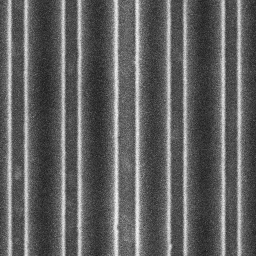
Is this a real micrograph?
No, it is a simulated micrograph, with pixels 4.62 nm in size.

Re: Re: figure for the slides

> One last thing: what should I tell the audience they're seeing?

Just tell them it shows parallel lines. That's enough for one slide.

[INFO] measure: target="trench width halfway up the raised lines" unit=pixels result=14.6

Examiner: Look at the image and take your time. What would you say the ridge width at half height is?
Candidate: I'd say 0.179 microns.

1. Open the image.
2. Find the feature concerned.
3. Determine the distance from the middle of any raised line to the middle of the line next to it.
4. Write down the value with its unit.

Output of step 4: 245 nm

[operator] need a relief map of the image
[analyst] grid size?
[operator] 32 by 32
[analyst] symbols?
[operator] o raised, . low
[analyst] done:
o..ooooo..ooooo..oooo..ooooo..oo
o..ooooo..ooooo..oooo..ooooo..oo
o..ooooo..ooooo..oooo..ooooo..oo
o..ooooo..ooooo..oooo..ooooo..oo
o..ooooo..ooooo..oooo..ooooo..oo
o..ooooo..ooooo..oooo..ooooo..oo
o..ooooo..ooooo..oooo..ooooo..oo
o..ooooo..ooooo..oooo..ooooo..oo
o..ooooo..ooooo..oooo..ooooo..oo
o..ooooo..ooooo..oooo..ooooo..oo
o..ooooo..ooooo..oooo..ooooo..oo
o..ooooo..ooooo..oooo..ooooo..oo
o..ooooo..ooooo..oooo..ooooo..oo
o..ooooo..ooooo..oooo..ooooo..oo
o..ooooo..ooooo..oooo..ooooo..oo
o..ooooo..ooooo..oooo..ooooo..oo
o..ooooo..ooooo..oooo..ooooo..oo
o..ooooo..ooooo..oooo..ooooo..oo
o..ooooo..ooooo..oooo..ooooo..oo
o..ooooo..ooooo..oooo..ooooo..oo
o..ooooo..ooooo..oooo..ooooo..oo
o..ooooo..ooooo..oooo..ooooo..oo
o..ooooo..ooooo..oooo..ooooo..oo
o..ooooo..ooooo..oooo..ooooo..oo
o..ooooo..ooooo..oooo..ooooo..oo
o..ooooo..ooooo..oooo..ooooo..oo
o..ooooo..ooooo..oooo..ooooo..oo
o..ooooo..ooooo..oooo..ooooo..oo
o..ooooo..ooooo..oooo..ooooo..oo
o..ooooo..ooooo..oooo..ooooo..oo
o..ooooo..ooooo..oooo..ooooo..oo
o..ooooo..ooooo..oooo..ooooo..oo